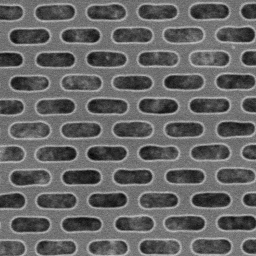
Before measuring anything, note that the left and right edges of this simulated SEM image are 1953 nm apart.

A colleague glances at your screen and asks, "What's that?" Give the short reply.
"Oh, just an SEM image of groups of lines, slits or small figures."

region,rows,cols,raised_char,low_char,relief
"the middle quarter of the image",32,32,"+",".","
..+++++.......++++++.......+++++
++++++++++++++++++++++++++++++++
++++++++++++++++++++++++++++++++
.........++++.........+++.......
..........++..........+++.......
.........+++..........+++.......
.........+++++.......++++++.....
++++++++++++++++++++++++++++++++
+++++++++.++++++++++...+.+++++++
..++++.........++++.........++++
...+++..........++...........++.
...+++..........+++.........++++
.+++++++......++++++++....++++++
++++++++++++++++++++++++++++++++
+......+++++++.......++++++.....
.........+++..........+++.......
.........+++..........+++.......
.........++++.........+++.......
+...++++++++++++++++++++++++++++
++++++++++++++++++++++++++++++++
.+++++++...++.++++++...+++++++++
...+++..........+++..........+++
...+++..........+++..........+++
...+++.........++++.........++++
++++++++++++++++++++++++++++++++
++++++++++++++++++++++++++++++++
+.......+++++........++++++.....
.........+++..........+++.......
.........+++..........+++.......
.........++++.........++++......
++++++++++++++++++++++++++++++++
++++++++++++++++++++++++++++++++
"